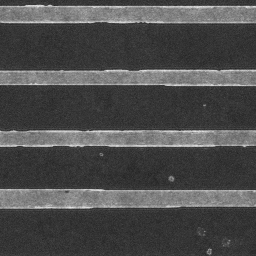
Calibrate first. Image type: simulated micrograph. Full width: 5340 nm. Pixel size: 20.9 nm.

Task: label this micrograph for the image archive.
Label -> lines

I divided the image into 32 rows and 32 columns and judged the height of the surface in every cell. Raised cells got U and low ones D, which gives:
DDDDDDDDDDDDDDDDDDDDDDDDDDDDDDDD
UUUUUUUUUUUUUUUUUUUUUUUUUUUUUUUU
UUUUUUUUUUUUUUUUUUUUUUUUUUUUUUUU
DDDDDDDDDDDDDDDDDDDDDDDDDDDDDDDD
DDDDDDDDDDDDDDDDDDDDDDDDDDDDDDDD
DDDDDDDDDDDDDDDDDDDDDDDDDDDDDDDD
DDDDDDDDDDDDDDDDDDDDDDDDDDDDDDDD
DDDDDDDDDDDDDDDDDDDDDDDDDDDDDDDD
DDDDDDDDDDDDDDDDDDDDDDDDDDDDDDDD
UUUUUUUUUUUUUUUUUUUUUUUUUUUUUUUU
UUUUUUUUUUUUUUUUUUUUUUUUUUUUUUUU
DDDDDDDDDDDDDDDDDDDDDDDDDDDDDDDD
DDDDDDDDDDDDDDDDDDDDDDDDDDDDDDDD
DDDDDDDDDDDDDDDDDDDDDDDDDDDDDDDD
DDDDDDDDDDDDDDDDDDDDDDDDDDDDDDDD
DDDDDDDDDDDDDDDDDDDDDDDDDDDDDDDD
DDDDUUUUUUDUUUUUUUUUUUUUUUUUUUUU
UUUUUUUUUUUUUUUUUUUUUUUUUUUUUUUU
DDDDDDDDDDDDDDDDDDDDDDDDDDDDDDDD
DDDDDDDDDDDDDDDDDDDDDDDDDDDDDDDD
DDDDDDDDDDDDDDDDDDDDDDDDDDDDDDDD
DDDDDDDDDDDDDDDDDDDDDDDDDDDDDDDD
DDDDDDDDDDDDDDDDDDDDDDDDDDDDDDDD
DDDDDDDDDDDDDDDDDDDDDDDDDDDDDDDD
UUUUUUUUUUUUUUUUUUUUUUUUUUUUUUUU
UUUUUUUUUUUUUUUUUUUUUUUUUUUUUUUU
DDDDDDDDDDDDDDDDDDDDDDDDDDDDDDDD
DDDDDDDDDDDDDDDDDDDDDDDDDDDDDDDD
DDDDDDDDDDDDDDDDDDDDDDDDDDDDDDDD
DDDDDDDDDDDDDDDDDDDDDDDDDDDDDDDD
DDDDDDDDDDDDDDDDDDDDDDDDDDDDDDDD
DDDDDDDDDDDDDDDDDDDDDDDDDDDDDDDD